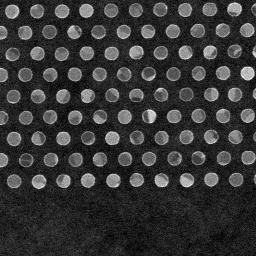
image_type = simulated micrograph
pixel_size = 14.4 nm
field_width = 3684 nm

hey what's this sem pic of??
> a regular array of raised bodies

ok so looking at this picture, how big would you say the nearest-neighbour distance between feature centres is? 348 nanometers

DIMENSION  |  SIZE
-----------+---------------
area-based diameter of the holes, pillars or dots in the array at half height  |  192 nm